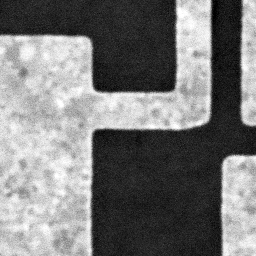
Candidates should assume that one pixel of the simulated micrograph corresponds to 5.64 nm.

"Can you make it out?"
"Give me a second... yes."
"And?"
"wiring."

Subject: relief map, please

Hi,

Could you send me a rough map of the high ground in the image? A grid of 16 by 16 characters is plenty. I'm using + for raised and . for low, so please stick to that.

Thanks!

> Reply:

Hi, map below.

...........++..+
...........++..+
+++++......++..+
++++++.....++..+
++++++.....++..+
++++++.....++..+
+++++++++++++..+
+++++++++++++..+
++++++..........
++++++..........
++++++........++
++++++........++
++++++........++
++++++........++
++++++........++
++++++........++